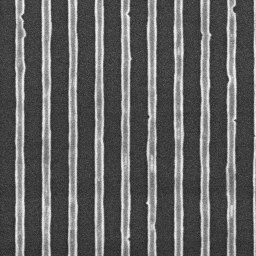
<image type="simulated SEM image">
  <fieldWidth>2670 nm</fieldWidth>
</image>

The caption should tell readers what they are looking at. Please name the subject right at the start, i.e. parallel lines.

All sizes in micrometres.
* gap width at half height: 0.2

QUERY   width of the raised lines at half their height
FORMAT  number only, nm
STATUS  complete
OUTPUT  73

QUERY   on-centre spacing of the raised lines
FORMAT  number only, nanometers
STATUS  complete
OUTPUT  276